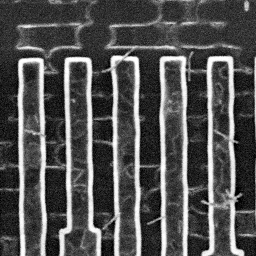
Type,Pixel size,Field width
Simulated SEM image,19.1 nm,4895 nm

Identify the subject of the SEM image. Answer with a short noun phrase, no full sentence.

wiring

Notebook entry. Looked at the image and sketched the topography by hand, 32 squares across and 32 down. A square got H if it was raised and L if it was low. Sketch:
LLLLLLLLLLLLLLLLLLLLLLLLLLLLLLLL
LLLLLLLLLLLLLLLLLLLLLLLLLLLLLLLL
LLLLLLLLLLLLLLLLLLLLLLLLLLLLLLLL
LLLLLLLLLLLLLLLLLLLLLLLLLLLLLLLL
LLLLLLLLLLLLLLLLLLLLLLLLLLLLLLLL
LLLLLLLLLLLLLLLLLLLLLLLLLLLLLLLL
LLLLLLLLLLLLLLLLLLLLLLLLLLLLLLLL
LLLLLLLLLHHLLLHHHLLLLHHLLLLHHLLL
LLLHHLLLHHHLLLHHHLLLHHHLLLHHHLLL
LLLHHLLLHHHLLLHHHLLLHHHLLLHHHLLL
LLLHHLLLHHHLLLHHHLLLHHHLLLHHHLLL
LLLHHLLLHHHLLLHHHLLLHHHLLLHHHLLL
LLLHHLLLHHHLLLHHHLLLHHHLLLHHHLLL
LLLHHLLLHHHLLLHHHLLLHHHLLLHHHLLL
LLLHHLLLHHHLLLHHHLLLHHHLLLHHHLLL
LLLHHLLLLHHLLLHHHLLLHHHLLLHHHLLL
LLLHHLLLLHHLLLHHHLLLHHHLLLHHHLLL
LLLHHLLLLHHLLLHHHLLLHHHLLLHHHLLL
LLLHHLLLLHHLLLHHHLLLHHHLLLHHHLLL
LLLHHLLLLHHLLLHHHLLLHHHLLLHHHLLL
LLLHHLLLLHHLLLHHHLLLHHHLLLHHHLLL
LLLHHLLLLHHLLLHHHLLLHHHLLLHHHLLL
LLLHHLLLLHHLLLLHHLLLHHHLLLHHHLLL
LLLHHLLLLHHLLLLHHLLLHHHLLLHHHLLL
LLLHHLLLLHHLLLLHHLLLHHHLLLHHHLLL
LLLHHLLLLHHLLLLHHLLLLHHLLLHHHLLL
LLLHHHLLLHHLLLLHHLLLHHHLLLHHHLLL
LLLHHHLLLHHLLLHHHLLLHHHLLLHHHLLL
LLLHHHLLLHHHLLLHHLLLLHHLLLHHHLLL
LLLHHLLLHHHHLLLHHLLLLHHLLLLHHLLL
LLLHHLLLHHHHLLLHHLLLLHHLLLLHHLLL
LLLHHLLLHHHHLLLHHLLLLHHLLLHHHHLL